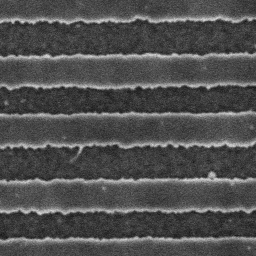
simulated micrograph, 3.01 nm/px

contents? lines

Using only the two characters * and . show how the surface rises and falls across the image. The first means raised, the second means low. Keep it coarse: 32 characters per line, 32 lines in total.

********************************
********************************
*****************.*********.**..
................................
................................
................................
................................
********************************
********************************
********************************
********************************
................................
................................
................................
********************************
********************************
********************************
********************************
....*..........*................
................................
................................
................................
....*.********.*****************
********************************
********************************
********************************
**.********..*.*....***.........
................................
................................
................................
********************************
********************************